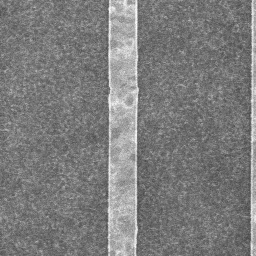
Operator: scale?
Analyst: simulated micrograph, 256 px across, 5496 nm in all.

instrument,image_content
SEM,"one or a few lines or trenches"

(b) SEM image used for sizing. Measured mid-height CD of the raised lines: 574 nm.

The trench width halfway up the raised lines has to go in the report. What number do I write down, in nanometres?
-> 2490